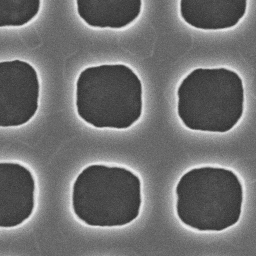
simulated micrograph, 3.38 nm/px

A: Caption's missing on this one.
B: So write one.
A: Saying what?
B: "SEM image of holes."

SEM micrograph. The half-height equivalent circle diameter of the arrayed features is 68.8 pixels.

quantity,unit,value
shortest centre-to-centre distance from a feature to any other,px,99.2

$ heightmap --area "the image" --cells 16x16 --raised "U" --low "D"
DDUUUDDDDUUDDDDU
DDUUUUDDUUUUDDDU
UUUUUUUUUUUUUUUU
UUUUUUUUUUUUUUUU
DDUUUDDDUUUUDDDU
DDUUUDDDDUUDDDDU
DDUUUDDDDUUDDDDU
DDUUUDDDDUUDDDDU
UUUUUUUUUUUUUUUU
UUUUUUUUUUUUUUUU
DDUUUDDDUUUUDDUU
DDUUUDDDDUUDDDDU
DDUUDDDDDUUDDDDU
DDUUUDDDUUUDDDDU
UUUUUUUUUUUUUUUU
UUUUUUUUUUUUUUUU